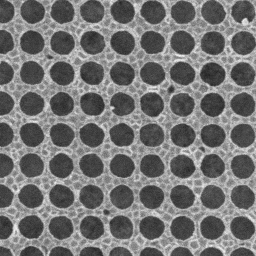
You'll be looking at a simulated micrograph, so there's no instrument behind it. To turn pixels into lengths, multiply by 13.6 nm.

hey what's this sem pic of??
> a regular array of holes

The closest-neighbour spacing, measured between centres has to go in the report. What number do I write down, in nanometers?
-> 409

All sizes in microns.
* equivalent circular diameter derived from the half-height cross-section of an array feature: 0.345